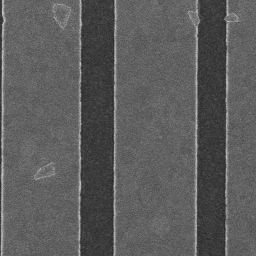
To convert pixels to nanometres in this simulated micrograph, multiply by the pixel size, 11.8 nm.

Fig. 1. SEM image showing one or a few lines or trenches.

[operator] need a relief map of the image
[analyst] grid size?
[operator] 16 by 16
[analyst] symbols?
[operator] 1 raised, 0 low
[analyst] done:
1111100111110011
1111100111110011
1111100111110011
1111100111110011
1111100111110011
1111100111110011
1111100111110011
1111100111110011
1111100111110011
1111100111110011
1111100111110011
1111100111110011
1111100111110011
1111100111110011
1111100111110011
1111100111110011